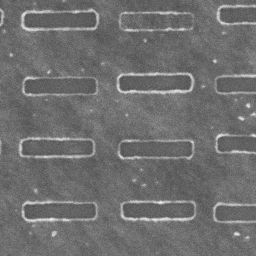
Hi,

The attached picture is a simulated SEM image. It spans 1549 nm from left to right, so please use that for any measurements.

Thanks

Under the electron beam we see holes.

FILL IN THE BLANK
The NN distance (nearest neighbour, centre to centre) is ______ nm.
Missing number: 373